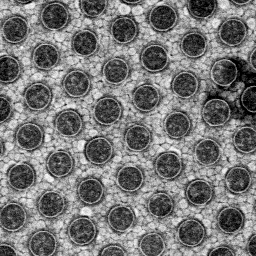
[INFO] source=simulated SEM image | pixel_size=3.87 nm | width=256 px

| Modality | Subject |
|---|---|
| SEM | a regular array of raised bodies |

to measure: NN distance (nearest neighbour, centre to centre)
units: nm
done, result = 157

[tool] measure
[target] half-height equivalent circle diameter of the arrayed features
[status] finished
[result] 0.0974 microns